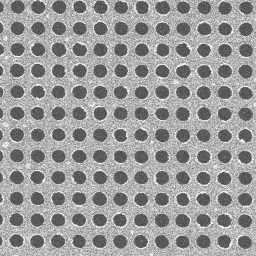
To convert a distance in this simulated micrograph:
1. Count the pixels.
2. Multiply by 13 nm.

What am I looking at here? a regular array of holes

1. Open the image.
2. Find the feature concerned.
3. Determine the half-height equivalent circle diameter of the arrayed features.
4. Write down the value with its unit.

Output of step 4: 180 nanometres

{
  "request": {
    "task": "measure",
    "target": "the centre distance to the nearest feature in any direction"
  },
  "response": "20.4 pixels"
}